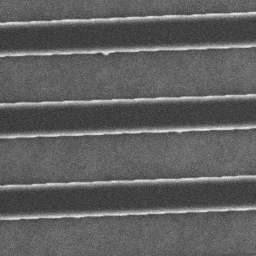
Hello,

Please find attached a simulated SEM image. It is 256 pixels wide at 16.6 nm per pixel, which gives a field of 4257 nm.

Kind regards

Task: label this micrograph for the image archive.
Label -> lines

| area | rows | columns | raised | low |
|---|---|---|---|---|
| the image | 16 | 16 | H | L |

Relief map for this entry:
LLLLLLLLLLLLLLLL
HHHHHHHHHHHHHHHH
HHHHHHHHHHHHHHHH
HLLLLLLLLLLLLLLL
LLLLLLLLLLLLLLLL
LLLLLLLLLLLLLLLL
LHHHHHHHHHHHHHHH
HHHHHHHHHHHHHHHH
HHHLLLLLLLLLLLLL
LLLLLLLLLLLLLLLL
LLLLLLLLLLLLLLLL
LLLHHHHHHHHHHHHH
HHHHHHHHHHHHHHHH
HHHHHHLLLLLLLLLL
LLLLLLLLLLLLLLLL
LLLLLLLLLLLLLLLL